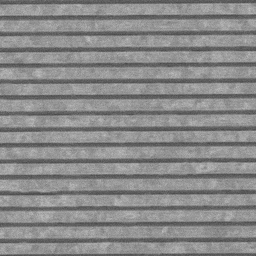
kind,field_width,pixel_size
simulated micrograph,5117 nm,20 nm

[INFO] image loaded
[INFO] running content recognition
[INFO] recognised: parallel lines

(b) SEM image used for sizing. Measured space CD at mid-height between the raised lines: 108 nm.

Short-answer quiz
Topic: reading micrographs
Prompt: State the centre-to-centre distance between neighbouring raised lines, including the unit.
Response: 318 nm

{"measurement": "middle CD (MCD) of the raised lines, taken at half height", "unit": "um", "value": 0.2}